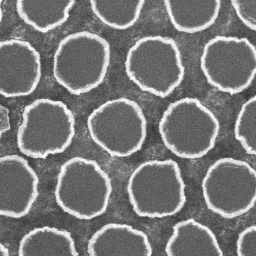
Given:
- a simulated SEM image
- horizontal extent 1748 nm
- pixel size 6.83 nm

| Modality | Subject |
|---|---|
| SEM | raised bodies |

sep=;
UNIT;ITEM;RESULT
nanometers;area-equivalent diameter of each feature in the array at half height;376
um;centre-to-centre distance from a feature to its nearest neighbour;0.483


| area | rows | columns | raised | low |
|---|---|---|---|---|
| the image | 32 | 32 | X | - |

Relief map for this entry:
--XXXXXXX---XXXXXX---XXXXXX--XXX
---XXXXX----XXXXX----XXXXXX---XX
---XXXXX-----XXXX-----XXXXX---XX
-----X----------------XXX-------
---------XXX--------------------
XXX-----XXXXX----XXXXX----XXXXX-
XXXX---XXXXXX---XXXXXX----XXXXXX
XXXXX--XXXXXX---XXXXXX---XXXXXXX
XXXXX--XXXXXX---XXXXXXX--XXXXXXX
XXXXX--XXXXXX---XXXXXXX---XXXXXX
XXXXX---XXXX-----XXXXX-----XXXX-
XXXX-----X---------XX-----------
-------------------------------X
X---XXXX----XXXXX----XXXX-----XX
X--XXXXXX--XXXXXXX---XXXXXX---XX
X--XXXXXX--XXXXXXX--XXXXXXX---XX
--XXXXXXX--XXXXXXX--XXXXXXX--XXX
--XXXXXXX---XXXXXX---XXXXXX---XX
---XXXXX-----XXXX----XXXXX-----X
-----X-----------------XX-------
XXX-----XXXX------XXXX-----XXXX-
XXXX----XXXXX----XXXXX----XXXXXX
XXXXX--XXXXXX---XXXXXXX---XXXXXX
XXXX---XXXXXXX--XXXXXXX--XXXXXXX
XXXX---XXXXXX---XXXXXXX---XXXXXX
XXXX----XXXXX----XXXXXX---XXXXX-
XXX------XXXX----XXXXX-----XXX--
--------------------------------
-------------XXX------XXXX------
---XXXXXX---XXXXXX----XXXXX---XX
---XXXXXX--XXXXXXX---XXXXXX---XX
X--XXXXXX--XXXXXXXX--XXXXXXX--XX